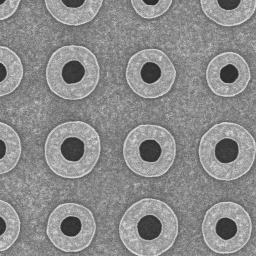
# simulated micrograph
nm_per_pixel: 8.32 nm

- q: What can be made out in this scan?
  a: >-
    a regular array of ring-shaped raised bodies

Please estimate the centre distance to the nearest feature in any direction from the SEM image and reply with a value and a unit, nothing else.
639 nm